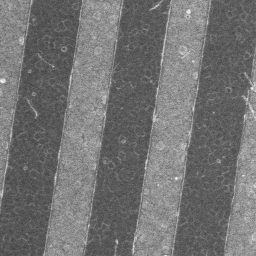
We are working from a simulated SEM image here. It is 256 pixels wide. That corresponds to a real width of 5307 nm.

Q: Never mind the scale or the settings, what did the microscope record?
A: one or a few lines or trenches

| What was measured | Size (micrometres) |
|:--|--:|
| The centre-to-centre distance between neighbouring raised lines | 1.84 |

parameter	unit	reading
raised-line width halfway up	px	50.8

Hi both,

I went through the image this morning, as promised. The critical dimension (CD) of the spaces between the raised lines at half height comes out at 804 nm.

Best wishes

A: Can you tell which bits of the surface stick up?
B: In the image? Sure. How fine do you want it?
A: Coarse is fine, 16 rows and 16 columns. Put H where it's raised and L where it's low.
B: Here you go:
LLHHHLLLHHHLLHHH
LLHHHLLHHHHLLHHH
LHHHHLLHHHLLLHHH
LHHHHLLHHHLLLHHH
LHHHHLLHHHLLHHHH
LHHHLLLHHHLLHHHH
LHHHLLLHHHLLHHHH
LHHHLLLHHHLLHHHL
LHHHLLHHHLLLHHHL
HHHHLLHHHLLLHHHL
HHHHLLHHHLLLHHHL
HHHLLLHHHLLHHHHL
HHHLLLHHHLLHHHHL
HHHLLLHHHLLHHHLL
HHHLLHHHLLLHHHLL
HHHLLHHHLLLHHHLL